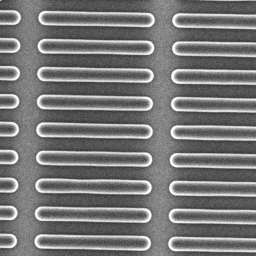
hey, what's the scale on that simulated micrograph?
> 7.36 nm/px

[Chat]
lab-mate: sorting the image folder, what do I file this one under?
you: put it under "groups of lines, slits or small figures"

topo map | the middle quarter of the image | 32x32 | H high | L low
LLLLLLLLLLLLLLLLLLLLLLLLLLLLLLLL
HHHHHHHHHHHHHHHHHHHHHLLLLLLLHHHH
HHHHHHHHHHHHHHHHHHHHHHLLLLLHHHHH
HHHHHHHHHHHHHHHHHHHHHHLLLLLHHHHH
LLLLLLLLLLLLLLLLLLLLLLLLLLLLHHHH
LLLLLLLLLLLLLLLLLLLLLLLLLLLLLLLL
LLLLLLLLLLLLLLLLLLLLLLLLLLLLLLLL
LLLLLLLLLLLLLLLLLLLLLLLLLLLLLLLL
HHHHHHHHHHHHHHHHHHHHHLLLLLLLHHHH
HHHHHHHHHHHHHHHHHHHHHHLLLLLHHHHH
HHHHHHHHHHHHHHHHHHHHHHLLLLLHHHHH
LLLLLLLLLLLLLLLLLLLLLLLLLLLLLLHH
LLLLLLLLLLLLLLLLLLLLLLLLLLLLLLLL
LLLLLLLLLLLLLLLLLLLLLLLLLLLLLLLL
LLLLLLLLLLLLLLLLLLLLLLLLLLLLLLLL
HHHHHHHHHHHHHHHHHHHHHLLLLLLLLLLL
HHHHHHHHHHHHHHHHHHHHHHLLLLLHHHHH
HHHHHHHHHHHHHHHHHHHHHHLLLLLHHHHH
LLLLLLLLLLLLLLLLLLLLLLLLLLLLLLHH
LLLLLLLLLLLLLLLLLLLLLLLLLLLLLLLL
LLLLLLLLLLLLLLLLLLLLLLLLLLLLLLLL
LLLLLLLLLLLLLLLLLLLLLLLLLLLLLLLL
HHHHHHHHHHHHHHHHHHHHHLLLLLLLLLLL
HHHHHHHHHHHHHHHHHHHHHHLLLLLHHHHH
HHHHHHHHHHHHHHHHHHHHHHLLLLLHHHHH
LLLLLLLLLLLLLLLLLLLLLLLLLLLLHHHH
LLLLLLLLLLLLLLLLLLLLLLLLLLLLLLLL
LLLLLLLLLLLLLLLLLLLLLLLLLLLLLLLL
LLLLLLLLLLLLLLLLLLLLLLLLLLLLLLLL
HHHHHHHHHHHHHHHHHHHHHLLLLLLLHHLL
HHHHHHHHHHHHHHHHHHHHHLLLLLLHHHHH
HHHHHHHHHHHHHHHHHHHHHLLLLLLHHHHH